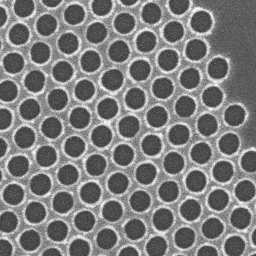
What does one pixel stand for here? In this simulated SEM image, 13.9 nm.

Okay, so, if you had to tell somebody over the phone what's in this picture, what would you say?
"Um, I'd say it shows a regular array of holes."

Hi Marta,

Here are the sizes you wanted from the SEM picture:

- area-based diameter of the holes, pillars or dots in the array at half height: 305 nm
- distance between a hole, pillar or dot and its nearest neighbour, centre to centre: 0.394 µm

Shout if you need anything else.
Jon